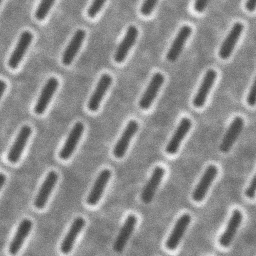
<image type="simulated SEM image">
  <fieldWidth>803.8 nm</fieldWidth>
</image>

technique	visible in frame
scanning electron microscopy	a regular array of holes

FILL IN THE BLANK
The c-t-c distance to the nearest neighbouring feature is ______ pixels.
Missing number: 52.4